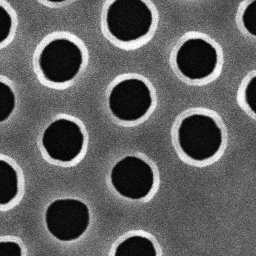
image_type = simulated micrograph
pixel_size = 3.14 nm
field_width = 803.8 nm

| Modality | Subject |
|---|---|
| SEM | holes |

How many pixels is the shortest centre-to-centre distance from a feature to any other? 78.1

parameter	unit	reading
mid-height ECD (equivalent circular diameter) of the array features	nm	133